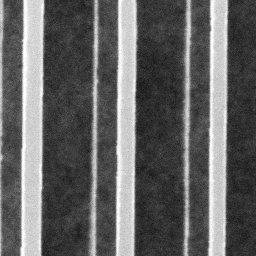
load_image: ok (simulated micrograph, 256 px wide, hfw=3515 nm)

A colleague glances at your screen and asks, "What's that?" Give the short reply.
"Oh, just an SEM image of lines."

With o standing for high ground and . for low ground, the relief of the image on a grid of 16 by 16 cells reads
ooo...oo....oo..
ooo...oo....oo..
ooo...oo....oo..
ooo...oo....oo..
ooo...oo....oo..
ooo...oo....oo..
ooo...oo....oo..
ooo...oo....oo..
ooo...oo....oo..
ooo...oo....oo..
ooo...oo....oo..
ooo...oo....oo..
ooo...oo....oo..
ooo...oo....oo..
ooo...oo....oo..
ooo...oo....oo..